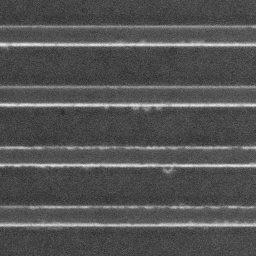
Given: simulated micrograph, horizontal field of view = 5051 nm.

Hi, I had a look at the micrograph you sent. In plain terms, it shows lines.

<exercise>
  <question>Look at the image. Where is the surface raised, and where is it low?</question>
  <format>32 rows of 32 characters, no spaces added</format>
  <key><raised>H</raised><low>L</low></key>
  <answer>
LLLLLLLLLLLLLLLLLLLLLLLLLLLLLLLL
LLLLLLLLLLLLLLLLLLLLLLLLLLLLLLLL
LLLLLLLLLLLLLLLLLLLLLLLLLLLLLLLL
HHHHHHHHHHHHHHHHHHHHHHHHHHHHHHHH
HHHHHHHHHHHHHHHHHHHHHHHHHHHHHHHH
HHHHHHHHHHHHHHHHHHHHHHHHHHHHHHHH
LLLLLLLLLLLLLLLLLLLLLLLLLLLLLLLL
LLLLLLLLLLLLLLLLLLLLLLLLLLLLLLLL
LLLLLLLLLLLLLLLLLLLLLLLLLLLLLLLL
LLLLLLLLLLLLLLLLLLLLLLLLLLLLLLLL
LLLLLLLLLLLLLLLLLLLLLLLLLLLLLLLL
HHHHHHHHHHHHHHHHHHHHHHHHHHHHHHHH
HHHHHHHHHHHHHHHHHHHHHHHHHHHHHHHH
LLLLLLLLLLLLLLLLLLLLLLLLLLLLLLLL
LLLLLLLLLLLLLLLLLLLLLLLLLLLLLLLL
LLLLLLLLLLLLLLLLLLLLLLLLLLLLLLLL
LLLLLLLLLLLLLLLLLLLLLLLLLLLLLLLL
LLLLLLLLLLLLLLLLLLLLLLLLLLLLLLLL
HHHHHHHHHHHHHHHHHHHHHHHHHHHHHHHH
HHHHHHHHHHHHHHHHHHHHHHHHHHHHHHHH
HHHHHHHHHHHHHHHHHHHHHHHHHHHHHHHH
LLLLLLLLLLLLLLLLLLLLLLLLLLLLLLLL
LLLLLLLLLLLLLLLLLLLLLLLLLLLLLLLL
LLLLLLLLLLLLLLLLLLLLLLLLLLLLLLLL
LLLLLLLLLLLLLLLLLLLLLLLLLLLLLLLL
LLLLLLLLLLLLLLLLLLLLLLLLLLLLLLLL
HHHHHHHHHHHHHHHHHHHHHHHHHHHHHHHH
HHHHHHHHHHHHHHHHHHHHHHHHHHHHHHHH
LLLLLLLLLLLLLLLLLLLLLLLLLLLLLLLL
LLLLLLLLLLLLLLLLLLLLLLLLLLLLLLLL
LLLLLLLLLLLLLLLLLLLLLLLLLLLLLLLL
LLLLLLLLLLLLLLLLLLLLLLLLLLLLLLLL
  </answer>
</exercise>